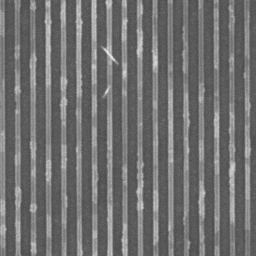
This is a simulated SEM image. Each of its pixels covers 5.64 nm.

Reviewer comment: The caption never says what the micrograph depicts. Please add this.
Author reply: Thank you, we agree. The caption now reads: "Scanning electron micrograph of parallel lines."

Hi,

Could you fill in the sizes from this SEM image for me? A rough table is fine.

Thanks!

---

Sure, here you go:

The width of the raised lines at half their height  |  23.3 nm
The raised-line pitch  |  0.0863 micrometres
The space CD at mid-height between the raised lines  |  61.3 nanometers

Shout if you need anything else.